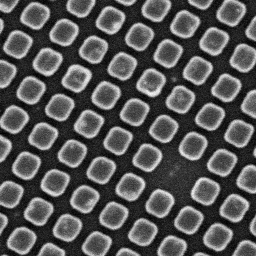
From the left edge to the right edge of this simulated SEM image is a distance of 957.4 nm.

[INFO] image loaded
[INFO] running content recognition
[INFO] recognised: a regular array of raised bodies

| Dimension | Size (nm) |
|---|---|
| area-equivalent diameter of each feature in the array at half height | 97.1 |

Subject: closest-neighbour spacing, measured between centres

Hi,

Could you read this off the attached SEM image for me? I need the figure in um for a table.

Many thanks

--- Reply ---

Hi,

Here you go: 0.124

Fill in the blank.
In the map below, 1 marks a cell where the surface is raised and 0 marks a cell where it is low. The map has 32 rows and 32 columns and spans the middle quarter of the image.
00110000000111111100000001100001
01111100000111111000011000000011
01111110000011111000111100000011
11111100000000110001111110000011
11111100000000000001111110000000
11111000011110000011111110000000
00110000111111000001111100011110
00000001111111000000011000011111
10000001111111000000000000111111
11000001111110001111000000111111
11000000011100011111100000111111
11000000000000011111100000001110
10001111000000111111100000000000
10001111100000111111000111100000
00011111110000001111000111110000
00011111100000000000001111110000
00011111100011100000001111110000
00000111000111111000001111110001
00000000000111111000000111100011
01100000001111110000000001000111
11111000001111110001110000000111
11111000000111100001111100000111
11111000000001000011111100000011
11111000110000000111111100000001
11110001111100000111111100000000
01100001111110000011111000000000
00000011111110000000110000000000
00000011111100001000000000000000
10000011111000011110000000000000
10000000110000111111000000000000
10000000000001111111000000000000
00011110000001111110000000000000